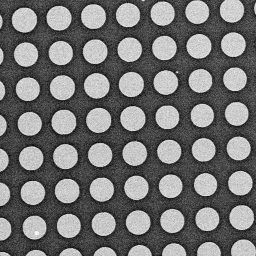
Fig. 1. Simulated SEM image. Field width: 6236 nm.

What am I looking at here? an array of small figures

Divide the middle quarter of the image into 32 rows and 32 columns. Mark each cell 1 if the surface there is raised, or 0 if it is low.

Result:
00000000000000000000000000000000
00000000000000000000000000000000
00000001100000011100000111100000
10000011111000111110000111110001
11000111111000111111000111110001
11100111111000111111000111110000
11100111111000111111000111110000
11000011111000011110000001000000
10000001000000000000000000000000
00000000000000000000000000000000
00000000000000000000000000000000
00000001110000011110000011110000
11000011111000111111000111111000
11100011111100111111000111111000
11100011111100111111000111111000
11100011111000011111000011110000
11000001110000001100000000000000
00000000000000000000000000000000
00000000000000000000000000000000
00000000000000000110000001110000
11000001111000011111000011111000
11100011111100011111000111111000
11100011111100011111100111111000
11100011111100011111000011111000
11100001111000001111000001110000
11000000110000000000000000000000
00000000000000000000000000000000
00000000000000000000000000000000
00000000000000001111000001111000
11100001111100001111100011111000
11100001111100011111100011111000
11110001111100011111100011111000